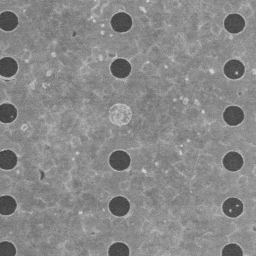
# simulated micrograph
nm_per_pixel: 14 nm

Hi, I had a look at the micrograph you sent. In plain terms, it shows a regular array of holes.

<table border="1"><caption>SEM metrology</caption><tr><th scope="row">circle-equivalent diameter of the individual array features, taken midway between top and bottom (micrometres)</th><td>0.303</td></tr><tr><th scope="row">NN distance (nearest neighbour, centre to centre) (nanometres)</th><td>642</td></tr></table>